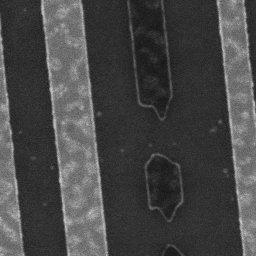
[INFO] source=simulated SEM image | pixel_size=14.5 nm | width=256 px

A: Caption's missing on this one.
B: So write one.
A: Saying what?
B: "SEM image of one or a few lines or trenches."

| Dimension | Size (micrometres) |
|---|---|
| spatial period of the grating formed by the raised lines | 1.21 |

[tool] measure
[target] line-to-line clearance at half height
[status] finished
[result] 686 nm